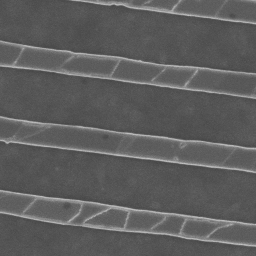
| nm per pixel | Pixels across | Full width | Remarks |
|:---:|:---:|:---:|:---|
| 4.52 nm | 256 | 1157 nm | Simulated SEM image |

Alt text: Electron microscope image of one or a few lines or trenches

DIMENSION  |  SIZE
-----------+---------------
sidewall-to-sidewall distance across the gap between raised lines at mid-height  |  228 nm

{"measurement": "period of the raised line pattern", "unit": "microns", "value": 0.334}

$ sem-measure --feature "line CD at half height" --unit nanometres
105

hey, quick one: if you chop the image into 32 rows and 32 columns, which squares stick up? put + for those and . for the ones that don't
............++++++++++++++++++++
....................++++++++++++
............................++++
................................
................................
++..............................
+++++++++.......................
++++++++++++++++................
..+++++++++++++++++++++++.......
..........++++++++++++++++++++++
..................++++++++++++++
..........................++++++
................................
................................
................................
++++++..........................
++++++++++++++..................
++++++++++++++++++++++..........
........+++++++++++++++++++++++.
................++++++++++++++++
........................++++++++
...............................+
................................
................................
+++++...........................
+++++++++++++...................
++++++++++++++++++++............
.....++++++++++++++++++++++.....
............++++++++++++++++++++
......................++++++++++
.............................+++
................................